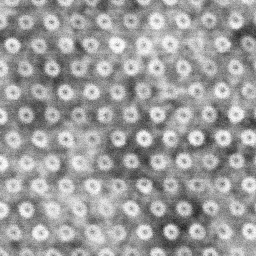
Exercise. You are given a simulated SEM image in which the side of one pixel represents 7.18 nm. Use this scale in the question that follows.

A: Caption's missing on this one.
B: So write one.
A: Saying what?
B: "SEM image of a regular array of ring-shaped raised bodies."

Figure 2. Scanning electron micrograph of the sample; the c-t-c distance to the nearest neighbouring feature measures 187 nanometres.